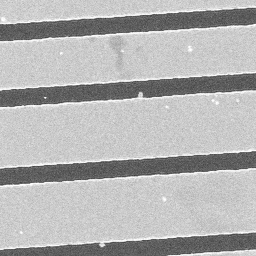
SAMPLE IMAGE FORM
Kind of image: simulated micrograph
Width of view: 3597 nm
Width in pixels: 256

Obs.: lines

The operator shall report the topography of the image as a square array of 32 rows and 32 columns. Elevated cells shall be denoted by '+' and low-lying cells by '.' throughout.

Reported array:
++++++++++++++++++++++++++++++++
++++++++++++++++++++++..........
+++++++.........................
...........................+++++
............++++++++++++++++++++
++++++++++++++++++++++++++++++++
++++++++++++++++++++++++++++++++
++++++++++++++++++++++++++++++++
++++++++++++++++++++++++++++++++
+++++++++++++++++++++++++.......
++++++++++......................
..............................++
...............+++++++++++++++++
++++++++++++++++++++++++++++++++
++++++++++++++++++++++++++++++++
++++++++++++++++++++++++++++++++
++++++++++++++++++++++++++++++++
++++++++++++++++++++++++++++++++
++++++++++++++++++++++++++++++++
+++++++++++++++++++++++.........
+++++++.........................
..........................++++++
...........+++++++++++++++++++++
++++++++++++++++++++++++++++++++
++++++++++++++++++++++++++++++++
++++++++++++++++++++++++++++++++
++++++++++++++++++++++++++++++++
++++++++++++++++++++++++++++++++
++++++++++++++++++++++++++++++++
++++++++++++++++++++++++........
+++++++++.......................
.............................+++